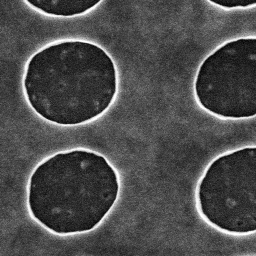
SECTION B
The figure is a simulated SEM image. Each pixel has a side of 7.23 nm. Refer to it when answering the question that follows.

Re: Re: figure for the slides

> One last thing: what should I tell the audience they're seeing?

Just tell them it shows holes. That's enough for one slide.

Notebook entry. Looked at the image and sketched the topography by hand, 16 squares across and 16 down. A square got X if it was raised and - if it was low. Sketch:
XX----XXXXXXXXXX
XXXXXXXXXXXXXXXX
XXXXXXXXXXXXXXX-
XX-----XXXXXX---
XX-----XXXXX----
XX-----XXXXX----
XX-----XXXXXX---
XXX---XXXXXXXXXX
XXXXXXXXXXXXXXXX
XXXX--XXXXXXXXX-
XX-----XXXXXX---
XX-----XXXXX----
XX-----XXXXX----
XX----XXXXXXX---
XXX--XXXXXXXXX--
XXXXXXXXXXXXXXXX